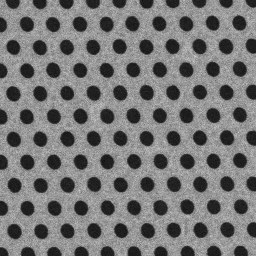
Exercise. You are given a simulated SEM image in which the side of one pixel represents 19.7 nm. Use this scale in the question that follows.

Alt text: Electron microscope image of a regular array of holes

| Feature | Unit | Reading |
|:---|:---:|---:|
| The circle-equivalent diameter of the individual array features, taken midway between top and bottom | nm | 288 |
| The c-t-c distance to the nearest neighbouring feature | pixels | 26.2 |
